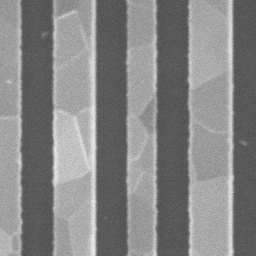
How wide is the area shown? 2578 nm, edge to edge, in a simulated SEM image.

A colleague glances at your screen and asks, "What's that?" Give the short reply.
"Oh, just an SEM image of lines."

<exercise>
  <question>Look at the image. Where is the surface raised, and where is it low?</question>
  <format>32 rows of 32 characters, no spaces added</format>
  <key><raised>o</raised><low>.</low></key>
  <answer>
oo.....ooooo....ooo.....ooooo...
oo.....ooooo....ooo.....ooooo...
ooo....ooooo....ooo.....ooooo...
oo.....ooooo....ooo.....ooooo...
ooo....ooooo....ooo.....ooooo...
ooo....ooooo....ooo.....ooooo...
ooo....ooooo....ooo.....ooooo...
ooo....ooooo....ooo.....ooooo...
ooo....ooooo....ooo.....ooooo...
oo.....ooooo....ooo.....ooooo...
oo.....ooooo....ooo.....ooooo...
oo.....ooooo....ooo.....ooooo...
oo.....ooooo....ooo.....ooooo...
ooo....ooooo....ooo.....ooooo...
ooo....ooooo....ooo.....ooooo...
ooo....ooooo....ooo.....ooooo...
ooo....ooooo....ooo.....ooooo...
ooo....ooooo....ooo.....ooooo...
oo.....ooooo....ooo.....ooooo...
oo.....ooooo....ooo.....ooooo...
ooo....ooooo....ooo.....ooooo...
oo.....ooooo....ooo.....ooooo...
oo.....ooooo....ooo.....ooooo...
ooo....ooooo....ooo.....ooooo...
ooo....ooooo....ooo.....ooooo...
oo.....ooooo....ooo.....ooooo...
ooo....ooooo....oooo....ooooo...
ooo....ooooo....ooo.....ooooo...
ooo....ooooo....ooo.....ooooo...
ooo....ooooo....ooo.....ooooo...
ooo....ooooo....ooo.....ooooo...
ooo....ooooo....ooo.....ooooo...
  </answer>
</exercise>